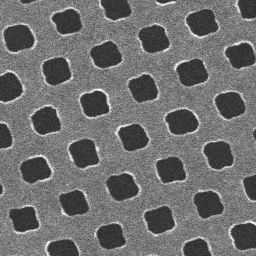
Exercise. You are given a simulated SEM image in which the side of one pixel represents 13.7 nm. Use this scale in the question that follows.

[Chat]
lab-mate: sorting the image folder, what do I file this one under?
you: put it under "a regular array of holes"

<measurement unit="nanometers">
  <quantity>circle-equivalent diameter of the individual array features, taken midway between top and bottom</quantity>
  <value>390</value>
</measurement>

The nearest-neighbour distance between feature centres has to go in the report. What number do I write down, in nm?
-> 686